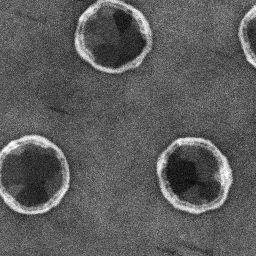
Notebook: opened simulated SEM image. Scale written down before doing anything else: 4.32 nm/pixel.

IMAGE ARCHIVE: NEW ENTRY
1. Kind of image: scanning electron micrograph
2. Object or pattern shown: raised bodies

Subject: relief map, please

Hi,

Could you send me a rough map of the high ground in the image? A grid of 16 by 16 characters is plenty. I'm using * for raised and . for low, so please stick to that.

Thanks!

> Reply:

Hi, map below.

......**........
.....****......*
.....****......*
.....****......*
................
................
................
................
................
****......****..
****......****..
****......****..
****.......***..
................
................
................